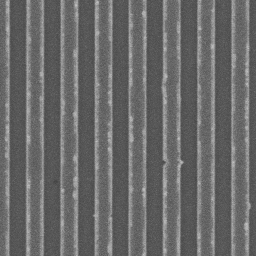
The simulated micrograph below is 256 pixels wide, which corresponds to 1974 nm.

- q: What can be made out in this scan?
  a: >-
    parallel lines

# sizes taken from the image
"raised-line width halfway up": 130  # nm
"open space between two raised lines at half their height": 0.136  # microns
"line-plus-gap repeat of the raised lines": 263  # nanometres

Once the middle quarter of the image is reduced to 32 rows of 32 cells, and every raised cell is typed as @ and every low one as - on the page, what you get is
@@@-----@@@@-----@@@-----@@@@---
@@@-----@@@@-----@@@-----@@@@---
@@@-----@@@@-----@@@-----@@@@---
@@@-----@@@@-----@@@-----@@@@---
@@@-----@@@@-----@@@-----@@@@---
@@@-----@@@@-----@@@-----@@@@---
@@@-----@@@@-----@@@-----@@@@---
@@@-----@@@@-----@@@-----@@@@---
@@@-----@@@@-----@@@-----@@@@---
@@@-----@@@@-----@@@-----@@@@---
@@@-----@@@@-----@@@-----@@@@---
@@@-----@@@@-----@@@-----@@@@---
@@@-----@@@@-----@@@-----@@@@---
@@@-----@@@@-----@@@-----@@@@---
@@@-----@@@@-----@@@-----@@@@---
@@@-----@@@@-----@@@-----@@@@---
@@@-----@@@@-----@@@-----@@@@---
@@@-----@@@@-----@@@-----@@@@---
@@@-----@@@@-----@@@-----@@@@---
@@@-----@@@@-----@@@-----@@@@---
@@@-----@@@@-----@@@-----@@@@---
@@@-----@@@@-----@@@-----@@@@---
@@@-----@@@@-----@@@-----@@@@---
@@@-----@@@@-----@@@-----@@@@---
@@@-----@@@@-----@@@-----@@@@@--
@@@-----@@@@-----@@@-----@@@@---
@@@-----@@@@-----@@@-----@@@@---
@@@-----@@@@-----@@@-----@@@@---
@@@-----@@@@-----@@@-----@@@@---
@@@-----@@@@-----@@@-----@@@@---
@@@-----@@@@-----@@@-----@@@@---
@@@-----@@@@-----@@@-----@@@@---